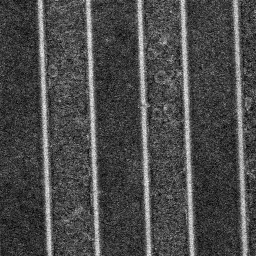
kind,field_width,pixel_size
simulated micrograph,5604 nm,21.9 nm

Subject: one or a few lines or trenches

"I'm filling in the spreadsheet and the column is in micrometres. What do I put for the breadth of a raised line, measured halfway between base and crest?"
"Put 1.14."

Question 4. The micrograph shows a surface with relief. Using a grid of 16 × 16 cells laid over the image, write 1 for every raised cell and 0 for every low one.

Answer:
1110001110011110
1110001110011110
1110001110001110
1110001110001110
1110001110001110
1110001110001110
1110001110001110
1110001110001110
1110001110001110
1110001110001110
1110001110001110
1110001110001110
1110001110001110
1110001110001110
1110001110001110
1110001110001110